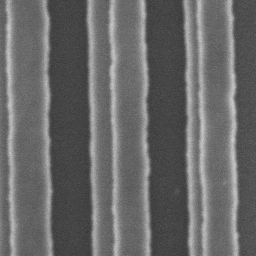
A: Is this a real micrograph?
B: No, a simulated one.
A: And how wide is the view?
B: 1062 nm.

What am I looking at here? lines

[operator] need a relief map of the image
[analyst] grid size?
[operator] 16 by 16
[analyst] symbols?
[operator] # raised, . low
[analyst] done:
###...###...##..
###...###...###.
###...###...###.
###...###...###.
###...###...###.
###...###...###.
###...###...###.
###...###...###.
###...###...###.
###...###...###.
###...###...###.
###...###...###.
###...###...###.
###...###...###.
###...###...###.
###...###...###.